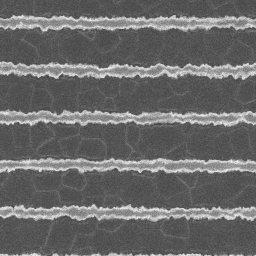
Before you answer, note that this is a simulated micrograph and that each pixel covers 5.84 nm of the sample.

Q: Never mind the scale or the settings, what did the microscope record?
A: parallel lines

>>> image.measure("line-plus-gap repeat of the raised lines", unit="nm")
278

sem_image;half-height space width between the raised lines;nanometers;222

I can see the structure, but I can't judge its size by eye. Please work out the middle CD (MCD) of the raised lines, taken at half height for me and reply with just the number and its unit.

54.1 nm